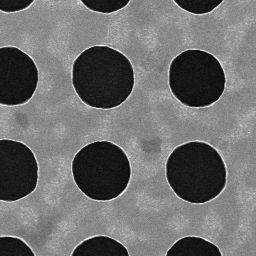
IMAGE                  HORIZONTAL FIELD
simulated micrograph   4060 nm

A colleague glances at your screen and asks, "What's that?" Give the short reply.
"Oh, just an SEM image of holes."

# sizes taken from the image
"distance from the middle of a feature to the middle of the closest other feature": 1.48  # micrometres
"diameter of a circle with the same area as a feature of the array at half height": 0.947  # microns